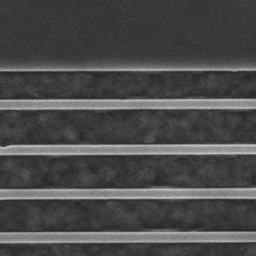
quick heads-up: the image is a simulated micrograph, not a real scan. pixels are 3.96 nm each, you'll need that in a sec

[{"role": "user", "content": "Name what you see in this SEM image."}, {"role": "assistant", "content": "parallel lines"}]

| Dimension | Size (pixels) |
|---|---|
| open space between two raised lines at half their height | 34.4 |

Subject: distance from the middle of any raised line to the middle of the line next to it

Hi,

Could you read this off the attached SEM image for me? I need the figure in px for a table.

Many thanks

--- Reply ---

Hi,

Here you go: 44.4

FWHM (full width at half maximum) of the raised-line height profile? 37.7 nanometres